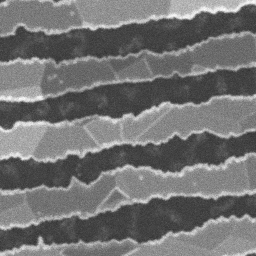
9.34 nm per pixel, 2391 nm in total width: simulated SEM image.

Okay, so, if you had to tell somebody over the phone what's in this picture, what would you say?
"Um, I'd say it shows one or a few lines or trenches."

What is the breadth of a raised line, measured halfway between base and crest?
301 nanometres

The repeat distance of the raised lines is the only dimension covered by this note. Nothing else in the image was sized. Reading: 61.1 px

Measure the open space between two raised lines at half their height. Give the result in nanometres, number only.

276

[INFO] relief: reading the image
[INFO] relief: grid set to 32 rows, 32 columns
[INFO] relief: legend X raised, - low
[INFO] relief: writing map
XXXXXXXXXXXXXXXXXXXXXXXXXXXXXXX-
XXXXXXXXXXXXXXXXXXXXXXXXX-X-----
XXXXXXXXXXXXXXXXXXX-------------
XX-XXXXXXX-X--------------------
----------------------------XXXX
-------------------------XXXXXXX
------------------X---XXXXXXXXXX
--X-XXX--XXXXXXXXXXXXXXXXXXXXXXX
XXXXXXXXXXXXXXXXXXXXXXXXXXXXXX--
XXXXXXXXXXXXXXXXXXXXX-----------
XXXXXXXXXXXXX-------------------
XXXXXXXX------------------------
-XXXX---------------------XXXXXX
-------------------XXXXXXXXXXXXX
----------------XXXXXXXXXXXXXXXX
--XXXX-XXXXXXXXXXXXXXXXXXXXXXXXX
XXXXXXXXXXXXXXXXXXXXXXXXX-XXXXX-
XXXXXXXXXXXXXXXXXXXXX-----------
XXXXXXXXXXXXX-------------------
XXXXXXXX-----------------------X
----------------------------XXXX
--------------XXXXXX--XXXXXXXXXX
---------X--XXXXXXXXXXXXXXXXXXXX
-----X--XXXXXXXXXXXXXXXXXXXXXXXX
XXXXXXXXXXXXXXXXXXXXX----XXX----
XXXXXXXXXXXXXXXX----------------
XXXXXXXXXXXXX-------------------
XXXXXX---------------------XXXXX
X------------------------XXXXXXX
---------------------XXXXXXXXXXX
-----X---XXXXXXXXXXXXXXXXXXXXXXX
XXXXXXXXXXXXXXXXXXXXXXXXXXXXXXXX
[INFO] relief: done